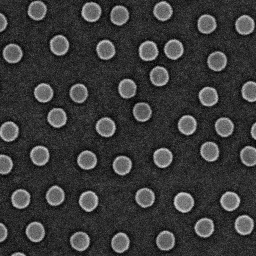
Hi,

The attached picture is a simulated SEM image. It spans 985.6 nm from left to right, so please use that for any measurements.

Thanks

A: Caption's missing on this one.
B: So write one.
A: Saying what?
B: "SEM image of a regular array of raised bodies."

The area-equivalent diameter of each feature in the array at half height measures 0.0713 micrometres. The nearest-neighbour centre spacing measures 135 nm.